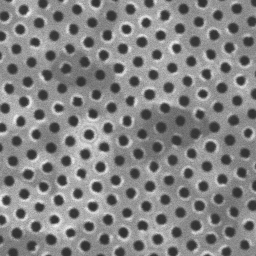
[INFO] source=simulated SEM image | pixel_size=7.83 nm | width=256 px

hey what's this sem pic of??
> a regular array of holes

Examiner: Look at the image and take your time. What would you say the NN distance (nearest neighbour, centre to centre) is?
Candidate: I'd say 19.8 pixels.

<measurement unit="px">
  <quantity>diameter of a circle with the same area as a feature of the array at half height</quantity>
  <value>10.5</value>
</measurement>